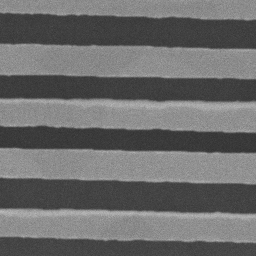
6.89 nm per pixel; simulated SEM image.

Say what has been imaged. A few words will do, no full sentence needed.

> lines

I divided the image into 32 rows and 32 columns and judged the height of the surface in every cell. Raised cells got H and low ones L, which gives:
HHHHHHHHHHHHHHHHHHHHHHHHHHHHHHHH
HHHHHHHHHHHHHHHHHHHHHHHHHHHHHHHH
LLLLLLLLLLLLLLLLLLLLLLLLLLLLLLLL
LLLLLLLLLLLLLLLLLLLLLLLLLLLLLLLL
LLLLLLLLLLLLLLLLLLLLLLLLLLLLLLLL
LLLLLLLLLLLLLLLLLLLLLLLLLLLLLLLL
HHHHHHHHHHHHHHHHHHHHHHHHHHHHHHHH
HHHHHHHHHHHHHHHHHHHHHHHHHHHHHHHH
HHHHHHHHHHHHHHHHHHHHHHHHHHHHHHHH
LLLLLLLLLLLLHHHHHHHHHHHHHHHHHHHH
LLLLLLLLLLLLLLLLLLLLLLLLLLLLLLLL
LLLLLLLLLLLLLLLLLLLLLLLLLLLLLLLL
HHHHHHHLLLLLLLLLLLLLLLLLLLLLLLLL
HHHHHHHHHHHHHHHHHHHHHHHHHHHHHHHH
HHHHHHHHHHHHHHHHHHHHHHHHHHHHHHHH
HHHHHHHHHHHHHHHHHHHHHHHHHHHHHHHH
LLLLLLLLLLLLLLLLLLLLLLLLLLLLLLLL
LLLLLLLLLLLLLLLLLLLLLLLLLLLLLLLL
LLLLLLLLLLLLLLLLLLLLLLLLLLLLLLLL
HHHHHHHHHHHHHHHHHHHHHHHHHHHHHHHH
HHHHHHHHHHHHHHHHHHHHHHHHHHHHHHHH
HHHHHHHHHHHHHHHHHHHHHHHHHHHHHHHH
LLLLLLLLLLLLLLLHHHHHHHHHHHHHHHHH
LLLLLLLLLLLLLLLLLLLLLLLLLLLLLLLL
LLLLLLLLLLLLLLLLLLLLLLLLLLLLLLLL
LLLLLLLLLLLLLLLLLLLLLLLLLLLLLLLL
HHHHHHHHHHHHHHHHHLLLLLLLLLLLLLLL
HHHHHHHHHHHHHHHHHHHHHHHHHHHHHHHH
HHHHHHHHHHHHHHHHHHHHHHHHHHHHHHHH
HHHHHHHHHHHHHHHHHHHHHHHHHHHHHHHH
LLLLLLLLLLLLLLLLLLLLLLLLLLLLLLLL
LLLLLLLLLLLLLLLLLLLLLLLLLLLLLLLL